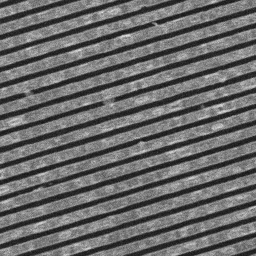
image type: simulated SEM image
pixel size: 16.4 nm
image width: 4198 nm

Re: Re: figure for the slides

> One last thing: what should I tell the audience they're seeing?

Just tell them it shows parallel lines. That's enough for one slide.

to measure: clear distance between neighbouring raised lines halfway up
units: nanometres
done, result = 86.5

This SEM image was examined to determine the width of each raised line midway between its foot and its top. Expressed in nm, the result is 159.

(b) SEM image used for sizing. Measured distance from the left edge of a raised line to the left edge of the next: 253 nanometers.